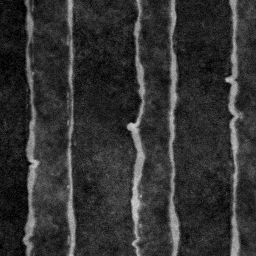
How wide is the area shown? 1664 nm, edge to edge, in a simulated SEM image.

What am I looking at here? one or a few lines or trenches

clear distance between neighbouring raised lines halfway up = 410 nm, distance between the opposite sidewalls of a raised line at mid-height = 258 nm